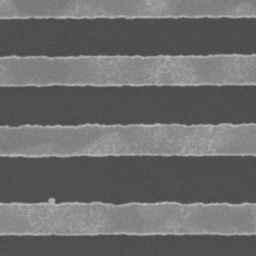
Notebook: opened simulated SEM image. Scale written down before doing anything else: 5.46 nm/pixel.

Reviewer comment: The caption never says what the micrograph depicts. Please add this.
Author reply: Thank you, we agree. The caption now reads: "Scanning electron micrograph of lines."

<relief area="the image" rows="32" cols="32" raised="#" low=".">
################################
################################
................................
................................
................................
................................
................................
################################
################################
################################
################################
................................
................................
................................
................................
................................
################################
################################
################################
...###.##.......................
................................
................................
................................
................................
................................
.##..##.#####...##.###..#.....##
################################
################################
################################
................................
................................
................................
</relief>